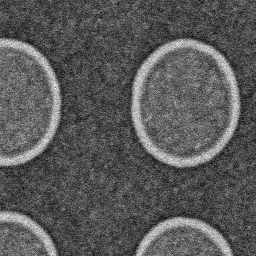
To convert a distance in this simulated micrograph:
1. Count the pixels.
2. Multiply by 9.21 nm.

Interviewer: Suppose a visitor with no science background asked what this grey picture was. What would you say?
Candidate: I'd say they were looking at raised bodies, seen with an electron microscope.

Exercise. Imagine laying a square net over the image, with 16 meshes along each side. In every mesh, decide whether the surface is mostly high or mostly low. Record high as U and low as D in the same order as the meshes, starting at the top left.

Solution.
DDDDDDDDDDDDDDDD
DDDDDDDDDDDDDDDD
DDDDDDDDDDDDDDDD
UUDDDDDDDDUUUUDD
UUUDDDDDDUUUUUDD
UUUDDDDDDUUUUUUD
UUUUDDDDUUUUUUUD
UUUDDDDDDUUUUUUD
UUUDDDDDDUUUUUDD
UUDDDDDDDDUUUDDD
DDDDDDDDDDDDDDDD
DDDDDDDDDDDDDDDD
DDDDDDDDDDDDDDDD
DDDDDDDDDDDDDDDD
UUUDDDDDDDUUUDDD
UUUDDDDDDUUUUUDD